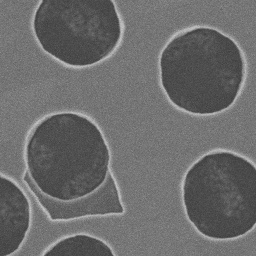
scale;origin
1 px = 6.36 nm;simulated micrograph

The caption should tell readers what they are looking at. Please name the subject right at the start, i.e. holes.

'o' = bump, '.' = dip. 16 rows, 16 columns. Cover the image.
oo.....ooooooooo
oo.....ooooooooo
oo.....oooo...oo
ooo....ooo.....o
oooooooooo.....o
oooooooooo.....o
ooooooooooo...oo
ooo..ooooooooooo
oo....oooooooooo
oo.....ooooooooo
oo.....ooooo....
.o....oooooo....
..oooooooooo....
..oooooooooo....
..ooooooooooo..o
.oo....ooooooooo